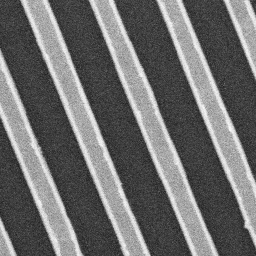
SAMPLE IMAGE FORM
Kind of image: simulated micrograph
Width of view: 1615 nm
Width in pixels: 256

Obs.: one or a few lines or trenches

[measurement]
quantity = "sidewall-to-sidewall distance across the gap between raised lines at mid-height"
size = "43.1 pixels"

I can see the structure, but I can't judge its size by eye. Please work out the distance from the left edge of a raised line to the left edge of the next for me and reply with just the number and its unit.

394 nm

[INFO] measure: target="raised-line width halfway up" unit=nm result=122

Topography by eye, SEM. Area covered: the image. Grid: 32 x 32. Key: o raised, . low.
...ooo......oo......ooo......oo.
....oo......oo.......oo......oo.
....ooo......oo......oo......ooo
....ooo......oo......ooo......oo
.....oo......ooo......oo......oo
.....ooo......oo......ooo......o
......oo......ooo......oo......o
......ooo.....ooo......oo......o
o.....ooo......oo......ooo......
o......oo......ooo......oo......
o......ooo......oo......ooo.....
oo......oo......ooo.....ooo.....
oo......ooo.....ooo......oo.....
ooo.....ooo......oo......ooo....
ooo......oo......ooo......oo....
.oo......ooo......oo......ooo...
.ooo......oo......ooo.....ooo...
..oo......ooo.....ooo......ooo..
..oo......ooo......oo......ooo..
..ooo......oo......ooo......oo..
...oo......ooo......oo......ooo.
...ooo......oo......ooo.....ooo.
....oo......oo.......oo......oo.
....ooo.....ooo......oo......ooo
.....oo......oo......ooo......oo
.....ooo.....ooo......oo......oo
.....ooo......oo......ooo.....oo
......oo......ooo......oo......o
......ooo......oo......oo......o
o.....ooo......oo......ooo......
o......ooo.....ooo......oo......
o......ooo......oo......ooo.....